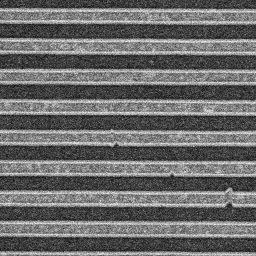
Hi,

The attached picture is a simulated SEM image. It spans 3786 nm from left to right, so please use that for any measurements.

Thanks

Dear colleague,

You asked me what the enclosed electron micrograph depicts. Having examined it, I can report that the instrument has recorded parallel lines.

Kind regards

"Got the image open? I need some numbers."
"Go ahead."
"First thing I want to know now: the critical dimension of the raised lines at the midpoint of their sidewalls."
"187 nm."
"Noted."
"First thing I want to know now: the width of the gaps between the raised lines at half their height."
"0.261 microns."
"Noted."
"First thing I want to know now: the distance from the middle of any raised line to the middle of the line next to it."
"450 nanometres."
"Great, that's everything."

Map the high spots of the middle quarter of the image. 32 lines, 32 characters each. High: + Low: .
................................
................................
++++++++++++++++++++++++++++++++
++++++++++++++++++++++++++++++++
++++++++++++++++++++++++++++++++
................................
................................
................................
................................
++++++++++++++++++++++++++++++++
++++++++++++++++++++++++++++++++
++++++++++++++++++++++++++++++++
................................
................................
................................
................................
................................
++++++++++++++++++++++++++++++++
++++++++++++++++++++++++++++++++
++++++++++++++++++++++++++++++++
................................
................................
................................
................................
....+++.........................
++++++++++++++++++++++++++++++++
++++++++++++++++++++++++++++++++
++++++++++++++++++++++++++++++++
................................
................................
................................
................................